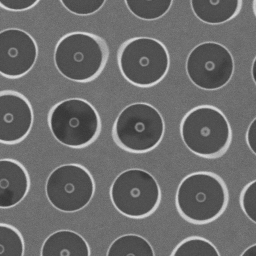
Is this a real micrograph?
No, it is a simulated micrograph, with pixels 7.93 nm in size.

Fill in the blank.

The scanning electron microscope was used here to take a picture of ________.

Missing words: an array of small figures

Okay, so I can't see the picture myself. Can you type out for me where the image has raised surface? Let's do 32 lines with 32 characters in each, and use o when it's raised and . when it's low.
....oooo.....ooo.....ooo......oo
ooooooooo...ooooo....ooo.....ooo
ooooooooooooooooooooooooo...oooo
oooooooooooooooooooooooooooooooo
....oooo...ooooooooooooooooooooo
....ooo......ooo....ooooo..ooooo
.o...oo......oo......ooo.....ooo
....ooo......oo......oo......ooo
....ooo......oo......oo......ooo
o.oooooo....oooo....oooo.....ooo
ooooooooooooooooo..oooooo...oooo
oooooooooooooooooooooooooooooooo
...oooooo.oooooooooooooooooooooo
....ooo.....oooo...oooooo..ooooo
....oo......ooo.....ooo.....oooo
....oo...o..ooo.....ooo.....ooo.
...oooo.....oo......ooo......oo.
..ooooo....oooo.....ooo......oo.
oooooooooooooooo...ooooo....ooo.
oooooooooooooooooooooooooooooooo
..oooooooooooooooooooooooooooooo
...oooo....ooooo..oooooooooooooo
o..ooo.....oooo....oooo....ooooo
...ooo..o...oo......oo......ooo.
...ooo.....ooo......oo...o..oo..
..ooooo....ooo......oo......oo..
ooooooooooooooo....oooo.....ooo.
oooooooooooooooooooooooo..oooooo
.ooooooooooooooooooooooooooooooo
..oooo....oooooo.ooooooooooooooo
...ooo.....ooo.....oooo...oooooo
...oo......ooo.....ooo.....oooo.